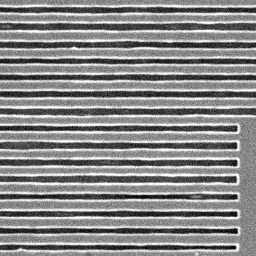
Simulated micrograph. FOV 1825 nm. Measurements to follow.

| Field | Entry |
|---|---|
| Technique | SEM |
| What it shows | parallel lines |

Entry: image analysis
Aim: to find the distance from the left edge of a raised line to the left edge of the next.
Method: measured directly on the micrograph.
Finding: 0.121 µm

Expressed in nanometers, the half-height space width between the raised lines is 47.2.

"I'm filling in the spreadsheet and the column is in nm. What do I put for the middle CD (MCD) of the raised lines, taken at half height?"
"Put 70.4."